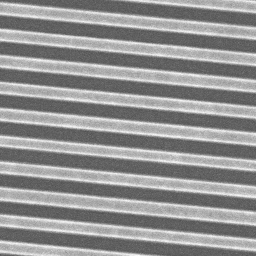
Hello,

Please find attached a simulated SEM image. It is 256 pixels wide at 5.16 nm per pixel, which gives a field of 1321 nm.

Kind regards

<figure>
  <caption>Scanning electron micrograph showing parallel lines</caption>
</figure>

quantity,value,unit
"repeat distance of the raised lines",136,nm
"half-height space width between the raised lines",81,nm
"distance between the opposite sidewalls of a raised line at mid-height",53.3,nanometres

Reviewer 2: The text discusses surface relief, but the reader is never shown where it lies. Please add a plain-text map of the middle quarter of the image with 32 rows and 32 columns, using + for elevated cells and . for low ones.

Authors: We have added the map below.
++++++++........................
+++++++++++++++++++.............
....+++++++++++++++++++++++++...
..............++++++++++++++++++
........................++++++++
................................
+...............................
+++++++++++.....................
++++++++++++++++++++++++........
.........+++++++++++++++++++++++
...................+++++++++++++
.............................+++
................................
++++++..........................
++++++++++++++++................
++++++++++++++++++++++++++......
.........+++++++++++++++++++++++
....................++++++++++++
..............................++
................................
+++++++++.......................
+++++++++++++++++++.............
......+++++++++++++++++++++++...
.................+++++++++++++++
...........................+++++
................................
+++.............................
+++++++++++++...................
++++++++++++++++++++++++........
.........+++++++++++++++++++++++
...................+++++++++++++
..............................++